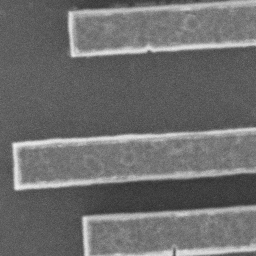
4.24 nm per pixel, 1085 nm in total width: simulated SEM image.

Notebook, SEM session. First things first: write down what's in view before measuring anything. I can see one or a few lines or trenches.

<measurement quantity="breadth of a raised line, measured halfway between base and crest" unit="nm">182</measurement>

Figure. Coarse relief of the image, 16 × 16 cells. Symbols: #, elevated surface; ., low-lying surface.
.........#######
....############
....############
................
................
................
................
................
..........######
.###############
.###############
.####...........
................
.......#########
.....###########
.....###########